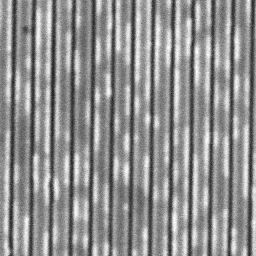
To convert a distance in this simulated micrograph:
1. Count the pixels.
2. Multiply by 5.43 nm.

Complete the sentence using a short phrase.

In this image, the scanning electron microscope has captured parallel lines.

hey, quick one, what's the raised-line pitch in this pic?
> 108 nm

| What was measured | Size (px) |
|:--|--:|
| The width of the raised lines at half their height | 13.9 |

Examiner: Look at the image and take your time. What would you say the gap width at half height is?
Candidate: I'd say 6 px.